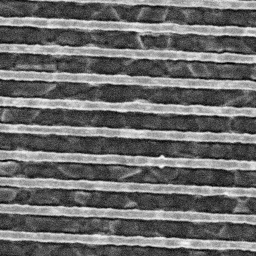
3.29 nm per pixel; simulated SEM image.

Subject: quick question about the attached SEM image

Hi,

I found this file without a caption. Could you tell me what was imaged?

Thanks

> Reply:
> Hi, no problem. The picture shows parallel lines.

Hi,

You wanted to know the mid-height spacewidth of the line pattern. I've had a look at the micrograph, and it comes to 60 nm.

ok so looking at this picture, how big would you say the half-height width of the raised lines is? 28.4 nm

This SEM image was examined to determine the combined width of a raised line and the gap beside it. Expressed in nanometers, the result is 88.